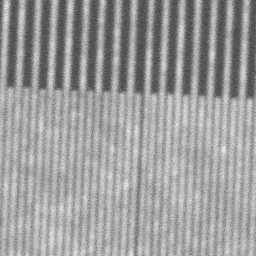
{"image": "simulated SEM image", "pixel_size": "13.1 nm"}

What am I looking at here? parallel lines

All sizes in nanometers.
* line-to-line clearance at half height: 44.3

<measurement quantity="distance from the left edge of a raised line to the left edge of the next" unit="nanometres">105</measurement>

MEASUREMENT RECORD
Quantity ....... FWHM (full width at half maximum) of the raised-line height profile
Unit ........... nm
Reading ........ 59